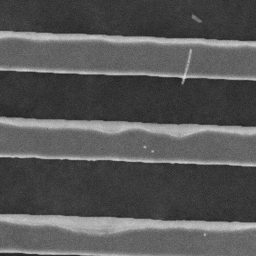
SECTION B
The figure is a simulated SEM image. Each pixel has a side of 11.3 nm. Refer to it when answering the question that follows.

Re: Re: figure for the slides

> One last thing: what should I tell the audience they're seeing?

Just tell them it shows lines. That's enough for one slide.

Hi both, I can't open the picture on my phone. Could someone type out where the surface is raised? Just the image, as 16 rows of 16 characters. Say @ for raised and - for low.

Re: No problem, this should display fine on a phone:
----------------
----------------
@@@@@@@@@@@@@---
@@@@@@@@@@@@@@@@
---@@@@@@@@@@@@@
----------------
----------------
@@--------------
@@@@@@@@@@@@@@@@
@@@@@@@@@@@@@@@@
----------------
----------------
----------------
@---------------
@@@@@@@@@@@@@@@@
@@@@@@@@@@@@@@@@